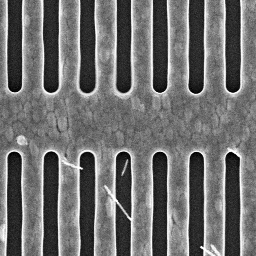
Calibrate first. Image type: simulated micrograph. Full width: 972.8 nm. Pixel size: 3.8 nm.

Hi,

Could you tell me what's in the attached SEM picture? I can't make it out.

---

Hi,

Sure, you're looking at groups of lines, slits or small figures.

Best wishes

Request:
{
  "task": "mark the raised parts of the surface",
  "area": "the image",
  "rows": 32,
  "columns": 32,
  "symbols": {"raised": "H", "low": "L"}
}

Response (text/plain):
HLLHHLLLHHLLHHLLHHHLLHHLLLHHLLHH
HLLHHLLLHHLLHHLLHHHLLHHLLLHHLLHH
HLLHHLLHHHLLHHLLHHHLLHHLLLHHLLHH
HLLHHLLHHHLLHHLLLHHLLHHLLLHHLLHH
HLLHHLLHHHLLHHLLLHHLLHHLLLHHLLHH
HLLHHLLHHHLLHHLLLHHLLHHLLLHHLLHH
HLLHHLLHHHLLHHLLLHHLLHHLLLHHLLHH
HLLHHLLLHHLLHHLLLHHLLHHLLLHHLLHH
HLLHHLLLHHLLHHLLLHHLLHHLLLHHLLHH
HLLHHLLLHHLLHHLLLHHLLHHLLLHHLLHH
HLLHHLLLHHLLHHLLLHHLLHHLLLHHLLHH
HHHHHHLHHHLLHHHLHHHHHHHHLHHHHLHH
HHHHHHHHHHHHHHHHHHHHHHHHHHHHHHHH
HHHHHHHHHHHHHHHHHHHHHHHHHHHHHHHH
HHHHHHHHHHHHHHHHHHHHHHHHHHHHHHHH
HHHHHHHHHHHHHHHHHHHHHHHHHHHHHHHH
HHHHHHHLHHHHHHHHHHHHHHHHHHHHHHHH
HHHHHHHHHHHHHHHHHHHHHHHHHHHHHHHH
HHHHHHHHHHHHHHHHHHHHHHHHHHHHHHHH
HLLHHHLHHHLLHHHLHHHLLHHHLHHHLLHH
HLLHHLLHHHLLHHLLHHHLLHHHLLHHLLHH
HLLHHLLHHHLLHHLLHHHLLHHLLLHHLLHH
HLLHHLLHHHLLHHLLLHHLLHHLLLHHLLHH
HLLHHLLHHHLLHHLLLHHLLHHLLLHHLLHH
HLLHHLLHHHLLHHLLLHHLLHHLLLHHLLHH
HLLHHLLHHHLLHHLLLHHLLHHLLLHHLLHH
HLLHHLLHHHLLHHLLLHHLLHHLLLHHLLHH
HLLHHLLHHHLLHHLLHHHLLLHLLLHHLLHH
HLLHHLLHHHLLHHLLHHHLLHHLLLHHLLHH
HLLHHLLHHHLLHHLLHHHLLHHLLLHHLLHH
HLLHHLLHHHLLHHLLHHHLLHHLLHHHLLHH
HLLHHLLHHHLLHHLLHHHLLHHLLHHHLLHH